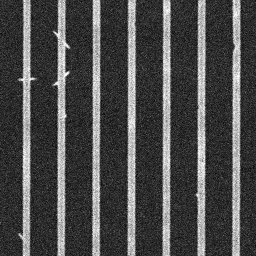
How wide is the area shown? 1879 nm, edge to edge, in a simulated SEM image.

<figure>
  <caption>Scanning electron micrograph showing parallel lines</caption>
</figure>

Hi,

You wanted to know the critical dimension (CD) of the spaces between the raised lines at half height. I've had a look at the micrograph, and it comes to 28.2 pixels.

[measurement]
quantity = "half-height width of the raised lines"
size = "48.6 nanometres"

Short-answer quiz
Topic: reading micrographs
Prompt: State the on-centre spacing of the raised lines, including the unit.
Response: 256 nm